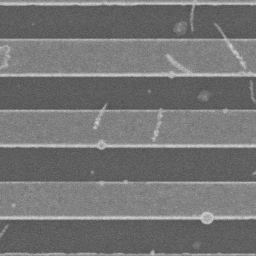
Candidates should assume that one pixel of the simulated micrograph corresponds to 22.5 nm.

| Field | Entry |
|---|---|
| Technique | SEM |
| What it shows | lines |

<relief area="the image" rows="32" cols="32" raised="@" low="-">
@@@@@@@@@@@@@@@@@@@@@@@@@@@@@@@@
--------------------------------
--------------------------------
--------------------------------
--------------------------------
@@@@@@@@@@@@@@@@@@@@@@@@@@@@@@@@
@@@@@@@@@@@@@@@@@@@@@@@@@@@@@@@@
@@@@@@@@@@@@@@@@@@@@@@@@@@@@@@@@
@@@@@@@@@@@@@@@@@@@@@@@@@@@@@@@@
---------------------@----------
--------------------------------
--------------------------------
--------------------------------
--------------------------------
@@@@@@@@@@@@@@@@@@@@@@@@@@@@@@@@
@@@@@@@@@@@@@@@@@@@@@@@@@@@@@@@@
@@@@@@@@@@@@@@@@@@@@@@@@@@@@@@@@
@@@@@@@@@@@@@@@@@@@@@@@@@@@@@@@@
------------@-------------------
--------------------------------
--------------------------------
--------------------------------
--------------------------------
@@@@@@@@@@@@@@@@@@@@@@@@@@@@@@@@
@@@@@@@@@@@@@@@@@@@@@@@@@@@@@@@@
@@@@@@@@@@@@@@@@@@@@@@@@@@@@@@@@
@@@@@@@@@@@@@@@@@@@@@@@@@@@@@@@@
-------------------------@@-----
--------------------------------
--------------------------------
--------------------------------
--------------------------------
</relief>